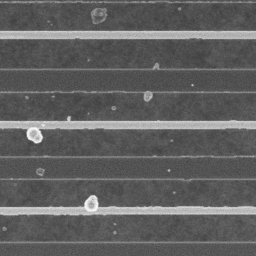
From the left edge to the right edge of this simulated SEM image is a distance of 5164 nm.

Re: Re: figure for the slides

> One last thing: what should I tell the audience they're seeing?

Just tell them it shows lines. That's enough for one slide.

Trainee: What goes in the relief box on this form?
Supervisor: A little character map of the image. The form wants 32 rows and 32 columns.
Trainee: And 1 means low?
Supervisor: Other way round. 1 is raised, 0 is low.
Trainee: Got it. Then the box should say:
00000000000000000000000000000000
00000000000010000000000000000000
00000000000010000000000000000000
00000000000000000000000000000000
00000000000000000000000000000000
00000000000000000000000000000000
00000000000000000000000000000000
00000000000000000000000000000000
00000000000000000001000000000000
11111111111111111111111111111111
11111111111111111111111111111111
11111111101111011111111111111111
00000000000000000000000000000000
00000000000000000000000000000000
00000000000000000000000000000000
00000000000000000000000000000000
00011000000000000000000000000000
00001000000000000000000000000000
00000000000000000000000000000000
00000000000000000000000000000000
11111111111111111111111111111111
11111111111111111111111111111111
00000000000000000000000000000000
00000000000000000000000000000000
00000000000000000000000000000000
00000000000100000000000000000000
00000000000000000000000000000000
00000000000000000000000000000000
00000000000000000000000000000000
00000000000000000000000000000000
11111111111111111111111111111111
11111111111111111111111111111111